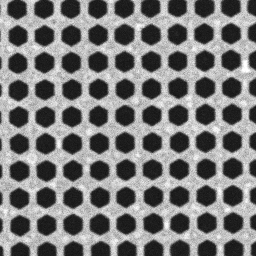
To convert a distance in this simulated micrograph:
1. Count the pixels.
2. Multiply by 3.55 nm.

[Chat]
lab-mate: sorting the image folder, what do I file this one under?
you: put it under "a regular array of holes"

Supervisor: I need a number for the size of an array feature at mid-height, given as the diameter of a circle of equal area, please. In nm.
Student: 72.5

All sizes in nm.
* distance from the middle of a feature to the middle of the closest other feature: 93.6